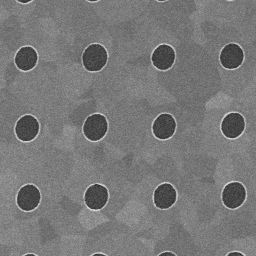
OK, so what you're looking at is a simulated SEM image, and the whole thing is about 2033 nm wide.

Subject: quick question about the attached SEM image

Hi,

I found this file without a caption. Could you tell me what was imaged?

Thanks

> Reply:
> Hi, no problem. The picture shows a regular array of holes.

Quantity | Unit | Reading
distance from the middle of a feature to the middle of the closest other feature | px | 68.4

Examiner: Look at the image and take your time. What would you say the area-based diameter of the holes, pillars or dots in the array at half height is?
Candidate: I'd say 201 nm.